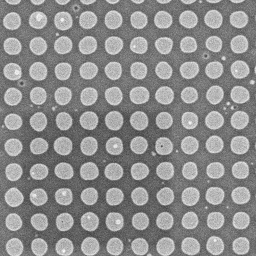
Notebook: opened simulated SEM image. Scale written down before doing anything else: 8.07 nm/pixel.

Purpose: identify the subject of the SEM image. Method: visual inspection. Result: an array of small figures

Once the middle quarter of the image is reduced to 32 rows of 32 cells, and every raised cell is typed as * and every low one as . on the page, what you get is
**..****...***...***...***...***
**..****..****...****..****..***
**..****...***...****..****..***
*....**....***....**....**....**
................................
................................
*....***...***...****...***...**
**..****..****...****..****..***
**..****...***...****..****..***
*....***...***...***....***...**
................................
................................
*....***...***...***....**....**
**..****..*****..****..****...**
**..****..*****..****..****...**
**..****...***...****...**....**
................................
................................
*.....*.....*.....**....**....**
**..****...***...****..****...**
**..****...****..****..****..***
**..****...****..***...****...**
*....**.....**..........**......
................................
................................
**...***...***...****...***...**
**..****..*****..****..****...**
**..****..*****..****..****...**
*....***...***....**....***....*
................................
................................
*....***...***....**....***...**